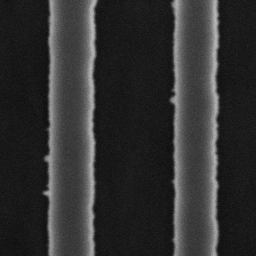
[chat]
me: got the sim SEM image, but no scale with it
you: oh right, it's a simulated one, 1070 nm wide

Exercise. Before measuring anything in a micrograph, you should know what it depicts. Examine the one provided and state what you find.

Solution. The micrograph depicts lines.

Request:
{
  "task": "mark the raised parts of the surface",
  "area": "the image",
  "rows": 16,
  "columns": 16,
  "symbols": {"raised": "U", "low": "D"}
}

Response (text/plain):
DDDUUUDDDDDUUUDD
DDDUUUDDDDDUUUDD
DDDUUUDDDDDUUUDD
DDDUUUDDDDDUUUDD
DDDUUUDDDDDUUDDD
DDDUUUDDDDDUUDDD
DDDUUUDDDDDUUUDD
DDDUUUDDDDDUUUDD
DDDUUUDDDDDUUUDD
DDDUUUDDDDDUUDDD
DDDUUUDDDDDUUUDD
DDDUUUDDDDDUUUDD
DDDUUUDDDDDUUDDD
DDDUUUDDDDDUUDDD
DDDUUUDDDDDUUUDD
DDDUUUDDDDDUUUDD